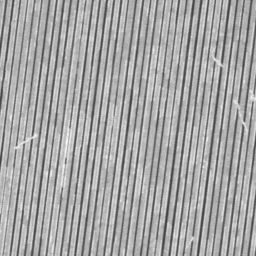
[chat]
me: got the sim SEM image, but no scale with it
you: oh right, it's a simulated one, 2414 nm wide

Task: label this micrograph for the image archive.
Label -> parallel lines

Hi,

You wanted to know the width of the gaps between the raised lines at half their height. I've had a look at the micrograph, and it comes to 1.86 px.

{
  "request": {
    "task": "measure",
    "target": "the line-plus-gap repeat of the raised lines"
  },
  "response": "67.5 nm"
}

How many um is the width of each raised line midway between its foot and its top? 0.0503